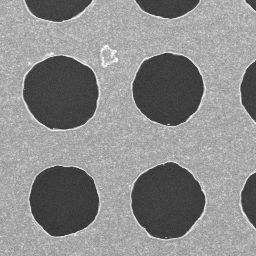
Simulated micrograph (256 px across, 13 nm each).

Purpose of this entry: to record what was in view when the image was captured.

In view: holes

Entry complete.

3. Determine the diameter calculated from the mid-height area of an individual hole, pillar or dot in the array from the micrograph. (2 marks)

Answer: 949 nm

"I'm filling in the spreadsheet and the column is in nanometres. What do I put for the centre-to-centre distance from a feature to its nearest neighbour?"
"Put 1370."